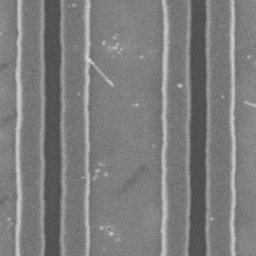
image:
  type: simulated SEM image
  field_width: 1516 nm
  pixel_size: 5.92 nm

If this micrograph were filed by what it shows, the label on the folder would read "lines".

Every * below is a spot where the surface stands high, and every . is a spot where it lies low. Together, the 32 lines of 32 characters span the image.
..***...***.........****..***...
..***...***..........***..***...
..***...***..........***..***...
..***...***..........***..***...
..***...***..........***..***...
..***...***..........***..***...
..***...***..........***..***...
..***...***..........***..***...
..****..***..........***..***...
..***...***..........***..***...
..***...***.........****..***...
..***...***.........****..***...
..****..***.........****..***...
..****..***.........****..***...
..****..***.........****..***...
..****..***.........****..***...
..***...***..........***..***...
..***...***..........***..***...
..***...***.........****..***...
..***...***.........****..***...
..***...***.........****..***...
..***...***.........****..***...
..***...***.........****..***...
..***...***.........****..***...
..***...***.........****..***...
..***...***.........****..***...
..***...***.........****..***...
..***...***.........****..***...
..***...***.........****..***...
..***...***.........****..***...
..****..***.........****..***...
..***...***.........***...***...